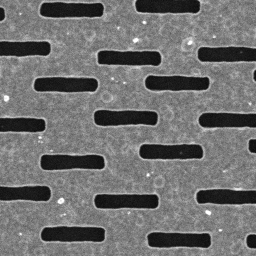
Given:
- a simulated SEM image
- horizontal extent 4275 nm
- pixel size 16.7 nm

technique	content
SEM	a regular array of holes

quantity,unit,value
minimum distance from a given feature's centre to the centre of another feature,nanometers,1050